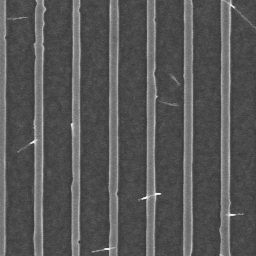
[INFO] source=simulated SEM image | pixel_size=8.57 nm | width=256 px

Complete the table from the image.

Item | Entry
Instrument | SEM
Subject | parallel lines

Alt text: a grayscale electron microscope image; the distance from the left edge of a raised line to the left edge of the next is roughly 37.3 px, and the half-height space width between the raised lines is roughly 252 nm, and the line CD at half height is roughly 0.0664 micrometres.